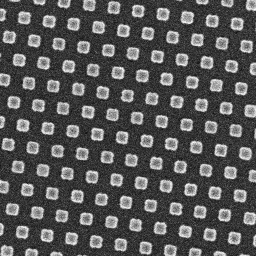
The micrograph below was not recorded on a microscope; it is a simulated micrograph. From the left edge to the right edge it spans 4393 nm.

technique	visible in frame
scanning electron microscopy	a regular array of raised bodies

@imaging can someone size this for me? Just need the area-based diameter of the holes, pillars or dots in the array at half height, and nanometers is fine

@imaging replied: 207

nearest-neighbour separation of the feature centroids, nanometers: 417